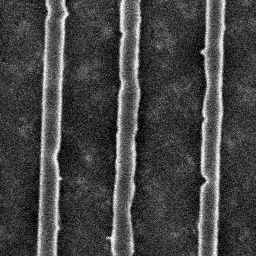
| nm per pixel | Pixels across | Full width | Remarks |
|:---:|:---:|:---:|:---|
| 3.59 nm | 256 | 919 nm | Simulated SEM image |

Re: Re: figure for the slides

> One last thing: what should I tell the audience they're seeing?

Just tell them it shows one or a few lines or trenches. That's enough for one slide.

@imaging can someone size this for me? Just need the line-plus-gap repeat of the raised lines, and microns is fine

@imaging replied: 0.288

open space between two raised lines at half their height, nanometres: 224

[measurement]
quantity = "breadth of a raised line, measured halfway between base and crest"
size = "0.061 um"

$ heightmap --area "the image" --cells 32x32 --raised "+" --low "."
......++.......++.........++....
......++.......++.........++....
......++.......++.........++....
......++.......++.........++....
......++.......++.........++....
......++.......++.........++....
......++.......++........+++....
......++.......++.........++....
......++.......++.........++....
......++.......++.........++....
......++.......++.........++....
......++.......++.........++....
.....+++.......++.........++....
.....+++.......++........+++....
.....+++.......++.........++....
.....+++.......++........+++....
.....++........++........++.....
.....++........++........++.....
.....++........++........++.....
.....++........++........++.....
.....++........++........++.....
.....++........++........++.....
.....++........++.........+.....
.....++.......+++........++.....
.....++.......+++........++.....
.....++.......++.........++.....
.....++.......++.........++.....
.....++.......++.........++.....
.....++.......+++........++.....
.....++.......+++........++.....
.....++.......+++........++.....
.....++.......+++........++.....